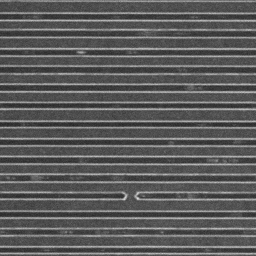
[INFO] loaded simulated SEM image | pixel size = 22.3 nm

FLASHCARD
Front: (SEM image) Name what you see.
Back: parallel lines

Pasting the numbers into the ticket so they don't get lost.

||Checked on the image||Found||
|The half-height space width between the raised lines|0.15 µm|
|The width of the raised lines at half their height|234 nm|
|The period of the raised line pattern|18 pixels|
